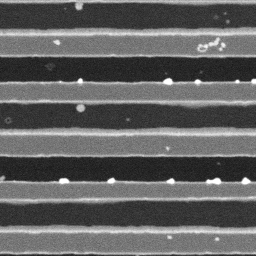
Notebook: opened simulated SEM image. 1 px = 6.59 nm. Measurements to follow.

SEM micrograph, lines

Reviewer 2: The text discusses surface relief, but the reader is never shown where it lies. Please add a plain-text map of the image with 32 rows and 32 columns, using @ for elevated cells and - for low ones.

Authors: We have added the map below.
--------------------------------
--------------------------------
--------------------------------
--------------------------------
@@@@@@@@@@@@@@@@@@@@@@@@@@@@@@@@
@@@@@@@@@@@@@@@@@@@@@@@@@@@@@@@@
@@@@@@@@@@@@@@@@@@@@@@@@@@@@@@@@
--------------------------------
--------------------------------
--------------------------------
@@@@@@@@@@@@@@@@@@@@@@@@@@@@@@@@
@@@@@@@@@@@@@@@@@@@@@@@@@@@@@@@@
@@@@@@@@@@@@@@@@@@@@@@@@@@@@@@@@
--------------------------------
--------------------------------
--------------------------------
-@---@@@@@@--------@@@@---@@@@--
@@@@@@@@@@@@@@@@@@@@@@@@@@@@@@@@
@@@@@@@@@@@@@@@@@@@@@@@@@@@@@@@@
@@@@@@@@@@@@@@@@@@@@@@@@@@@@@@@@
--------------------------------
--------------------------------
-------@@------------@----@@--@-
@@@@@@@@@@@@@@@@@@@@@@@@@@@@@@@@
@@@@@@@@@@@@@@@@@@@@@@@@@@@@@@@@
--------------------------------
--------------------------------
--------------------------------
--------------------------------
@@@@@@@@@@@@@@@@@@@@@@@@@@@@@@@@
@@@@@@@@@@@@@@@@@@@@@@@@@@@@@@@@
@@@@@@@@@@@@@@@@@@@@@@@@@@@@@@@@